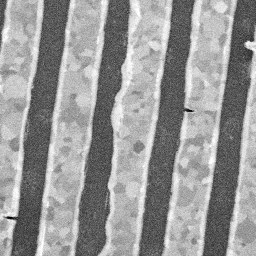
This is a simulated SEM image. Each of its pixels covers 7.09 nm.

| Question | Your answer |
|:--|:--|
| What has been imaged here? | one or a few lines or trenches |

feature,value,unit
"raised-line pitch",0.449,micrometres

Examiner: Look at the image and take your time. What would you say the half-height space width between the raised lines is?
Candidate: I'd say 204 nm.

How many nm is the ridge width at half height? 242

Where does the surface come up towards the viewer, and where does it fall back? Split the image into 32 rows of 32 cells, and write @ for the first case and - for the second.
-@@@@----@@@@----@@@@----@@@@---
-@@@@----@@@@----@@@@----@@@@---
-@@@@----@@@@----@@@@---@@@@@---
-@@@@----@@@@---@@@@@---@@@@@---
@@@@@---@@@@@---@@@@@---@@@@@---
@@@@@---@@@@@---@@@@@---@@@@@--@
@@@@@---@@@@----@@@@@---@@@@----
@@@@----@@@@----@@@@----@@@@----
@@@@----@@@@----@@@@----@@@@----
@@@@----@@@@----@@@@----@@@@----
@@@@----@@@@----@@@@----@@@@---@
@@@@---@@@@@---@@@@@---@@@@@---@
@@@@---@@@@@---@@@@@---@@@@@---@
@@@----@@@@@---@@@@@---@@@@----@
@@@----@@@@----@@@@----@@@@----@
@@@----@@@@----@@@@----@@@@----@
@@@----@@@@----@@@@----@@@@----@
@@@----@@@@---@@@@@----@@@@----@
@@@---@@@@@---@@@@@----@@@@----@
@@@---@@@@@---@@@@----@@@@@---@@
@@@---@@@@@---@@@@----@@@@@---@@
@@----@@@@----@@@@----@@@@----@@
@@----@@@@----@@@@----@@@@----@@
@@----@@@@----@@@@----@@@@----@@
@@----@@@@----@@@@----@@@@----@@
@@----@@@@----@@@@----@@@@----@@
@@---@@@@@----@@@@---@@@@@---@@@
@----@@@@-----@@@----@@@@----@@@
@----@@@@-----@@@----@@@@----@@@
@----@@@@-----@@@----@@@@----@@@
@----@@@@-----@@@----@@@@----@@@
@----@@@@----@@@@----@@@@----@@@